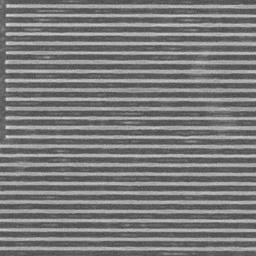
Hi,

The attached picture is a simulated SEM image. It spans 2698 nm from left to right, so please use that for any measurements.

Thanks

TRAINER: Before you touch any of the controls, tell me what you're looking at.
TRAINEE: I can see parallel lines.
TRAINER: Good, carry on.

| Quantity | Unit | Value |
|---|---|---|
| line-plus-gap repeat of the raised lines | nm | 98.2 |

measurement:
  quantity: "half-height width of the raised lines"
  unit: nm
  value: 36.9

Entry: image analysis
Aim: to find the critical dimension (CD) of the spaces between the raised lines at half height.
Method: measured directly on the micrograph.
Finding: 0.0658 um